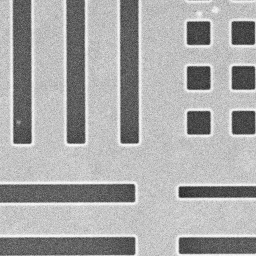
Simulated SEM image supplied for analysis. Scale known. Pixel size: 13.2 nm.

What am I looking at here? groups of lines, slits or small figures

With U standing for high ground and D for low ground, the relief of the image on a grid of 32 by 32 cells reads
UUDDUUUUDDDUUUUDDUUUUUUUUUUUUUUU
UUDDUUUUDDDUUUUDDUUUUUUUUUUUUUUU
UUDDUUUUDDDUUUUDDUUUUUUUUUUUUUUU
UUDDUUUUDDDUUUUDDUUUUUUDDDUUUDDD
UUDDUUUUDDDUUUUDDUUUUUUDDDUUUDDD
UUDDUUUUDDDUUUUDDUUUUUUUDDUUUDDD
UUDDUUUUDDDUUUUDDUUUUUUUUUUUUUUU
UUDDUUUUDDDUUUUDDUUUUUUUUUUUUUUU
UUDDUUUUDDDUUUUDDUUUUUUUDDUUUDDD
UUDDUUUUDDDUUUUDDUUUUUUDDDUUUDDD
UUDDUUUUDDDUUUUDDUUUUUUDDDUUUDDD
UUDDUUUUDDDUUUUDDUUUUUUUUUUUUUUU
UUDDUUUUDDDUUUUDDUUUUUUUUUUUUUUU
UUDDUUUUDDDUUUUDDUUUUUUUUUUUUUUU
UUDDUUUUDDDUUUUDDUUUUUUDDDUUUDDD
UUDDUUUUDDDUUUUDDUUUUUUDDDUUUDDD
UUDDUUUUDDDUUUUDDUUUUUUDDDUUUDDD
UUDDUUUUDDDUUUUDDUUUUUUUUUUUUUUU
UUUUUUUUUUUUUUUUUUUUUUUUUUUUUUUU
UUUUUUUUUUUUUUUUUUUUUUUUUUUUUUUU
UUUUUUUUUUUUUUUUUUUUUUUUUUUUUUUU
UUUUUUUUUUUUUUUUUUUUUUUUUUUUUUUU
UUUUUUUUUUUUUUUUUUUUUUUUUUUUUUUU
DDDDDDDDDDDDDDDDDUUUUUDDDDDDDDDD
DDDDDDDDDDDDDDDDDUUUUUDDDDDDDDDD
UUUUUUUUUUUUUUUUUUUUUUUUUUUUUUUU
UUUUUUUUUUUUUUUUUUUUUUUUUUUUUUUU
UUUUUUUUUUUUUUUUUUUUUUUUUUUUUUUU
UUUUUUUUUUUUUUUUUUUUUUUUUUUUUUUU
UUUUUUUUUUUUUUUUUUUUUUUUUUUUUUUU
DDDDDDDDDDDDDDDDDUUUUUDDDDDDDDDD
DDDDDDDDDDDDDDDDDUUUUUDDDDDDDDDD